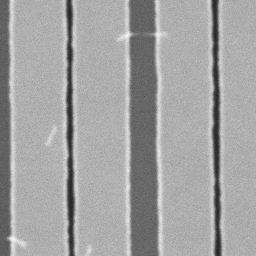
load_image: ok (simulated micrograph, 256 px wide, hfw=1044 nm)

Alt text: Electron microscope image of lines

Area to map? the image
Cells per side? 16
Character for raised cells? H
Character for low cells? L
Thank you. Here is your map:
LHHHHHHHLLHHHHHH
LHHHHHHHLLHHHHHH
LHHHHHHHLLHHHHHH
LHHHHHHHLLHHHHHH
LHHHHHHHLLHHHHHH
LHHHHHHHLLHHHHHH
LHHHHHHHLLHHHHHH
LHHHHHHHLLHHHHHH
LHHHHHHHLLHHHHHH
LHHHHHHHLLHHHHHH
LHHHHHHHLLHHHHHH
LHHHHHHHLLHHHHHH
LHHHHHHHLLHHHHHH
LHHHHHHHLLHHHHHH
LHHHHHHHLLHHHHHH
LHHHHHHHLLHHHHHH